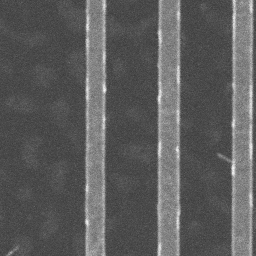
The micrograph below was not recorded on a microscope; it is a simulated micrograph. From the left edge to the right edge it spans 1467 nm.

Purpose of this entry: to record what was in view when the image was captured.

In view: one or a few lines or trenches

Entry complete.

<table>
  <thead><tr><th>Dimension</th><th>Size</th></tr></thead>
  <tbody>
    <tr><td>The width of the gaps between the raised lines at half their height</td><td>308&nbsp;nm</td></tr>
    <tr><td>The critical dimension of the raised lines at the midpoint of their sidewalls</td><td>112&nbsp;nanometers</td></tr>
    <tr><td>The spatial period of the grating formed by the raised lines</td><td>420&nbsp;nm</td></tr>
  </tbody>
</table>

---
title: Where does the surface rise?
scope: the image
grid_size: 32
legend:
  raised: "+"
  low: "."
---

...........++.......++.......+++
...........++.......++.......+++
...........++.......++.......+++
...........++.......++.......+++
...........++.......+++......+++
...........++.......++.......+++
...........++.......++.......++.
...........++.......++.......++.
...........++.......++.......++.
...........++.......++.......+++
...........++.......++.......++.
...........++.......++.......++.
...........++.......++.......++.
...........++.......++.......++.
...........++.......++.......++.
...........++.......++.......++.
...........++.......++.......++.
...........++.......++.......++.
...........++.......++.......++.
...........++.......++.......++.
...........++.......++.......++.
...........++.......++.......++.
...........++.......++.......++.
...........++.......++.......++.
...........++.......++.......++.
...........++.......++.......++.
...........++.......++.......++.
...........++.......++.......+++
...........++.......++.......+++
...........++.......++.......++.
...........++.......++.......++.
...........++.......++.......++.